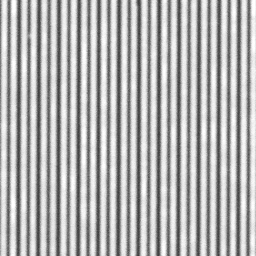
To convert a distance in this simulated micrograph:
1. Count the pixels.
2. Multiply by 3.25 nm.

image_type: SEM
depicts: parallel lines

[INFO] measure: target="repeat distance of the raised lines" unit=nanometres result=32.6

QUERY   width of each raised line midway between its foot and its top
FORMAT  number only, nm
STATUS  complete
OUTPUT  22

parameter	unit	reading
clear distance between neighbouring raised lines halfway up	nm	9.4